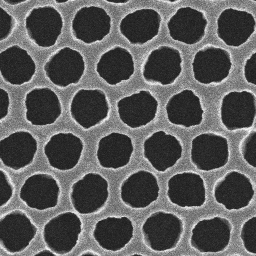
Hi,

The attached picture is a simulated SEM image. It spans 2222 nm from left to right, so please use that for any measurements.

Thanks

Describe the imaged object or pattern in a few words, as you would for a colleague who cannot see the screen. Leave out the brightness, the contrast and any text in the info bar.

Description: a regular array of holes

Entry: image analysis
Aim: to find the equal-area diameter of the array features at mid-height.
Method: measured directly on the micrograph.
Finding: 37.2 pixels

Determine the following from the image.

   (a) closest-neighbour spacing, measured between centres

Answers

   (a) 402 nanometres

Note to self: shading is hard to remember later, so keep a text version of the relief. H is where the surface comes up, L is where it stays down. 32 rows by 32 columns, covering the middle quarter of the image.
LLLLLHHHLLLLLLLLLLHHLLLLLLLLLHHH
LLLLLHHHLLLLLLLLLLHHLLLLLLLLLHHH
LLLLLHHHHLLLLLLLLHHHLLLLLLLLLHHH
LLLLHHHHHLLLLLLLHHHHLLLLLLLLHHHH
LLLHHHHHHHHLLLHHHHHHHHHHLLLHHHHH
LHHHHHHHHHHHHHHHHHHHHHHHHHHHHHHH
HHHHLLLLLHHHHHHHHHHHHHHHHHHHHHLH
HHHLLLLLLLHHHHHHHLLLLLHHHHHHLLLL
HHLLLLLLLLHHHHHLLLLLLLLHHHHLLLLL
HHLLLLLLLLLHHHLLLLLLLLLHHHLLLLLL
HHLLLLLLLLLHHLLLLLLLLLLHHHLLLLLL
HHLLLLLLLLLHHHLLLLLLLLLHHHLLLLLL
HHLLLLLLLLLHHHLLLLLLLLLHHHLLLLLL
HHLLLLLLLLHHHHLLLLLLLLLHHHLLLLLL
HHHLLLLLLHHHHHHLLLLLLHHHHHHLLLLL
HHHHLLLHHHHHHHHHLLLHHHHHHHHHHHLL
HHHHHHHHHHHHHHHHHHHHHHHHHHHHHHHH
LLHHHHHHHHHLLLLHHHHHHHLLLHHHHHHH
LLLLHHHHHHLLLLLLHHHHHLLLLLLLHHHH
LLLLLHHHHLLLLLLLLHHHLLLLLLLLLHHH
LLLLLHHHHLLLLLLLLHHHLLLLLLLLLHHH
LLLLLHHHLLLLLLLLLHHHLLLLLLLLLLHH
LLLLHHHHLLLLLLLLLHHHLLLLLLLLLHHH
LLLLHHHHLLLLLLLLLHHHHLLLLLLLLHHH
LLLHHHHHHLLLLLLLHHHHHLLLLLLLHHHH
LLLHHHHHHHLLLLLHHHHHHHLLLLLHHHHH
LHHHHHHHHHHHHHHHHHHHHHHLLHHHHHHH
HHHHHHLLHHHHHHHHHLLLLLHHHHHHLLLL
HHHHHLLLLLHHHHHHLLLLLLLHHHHLLLLL
HHHLLLLLLLLHHHHLLLLLLLLHHHLLLLLL
HHLLLLLLLLLHHHLLLLLLLLLLHHLLLLLL
HHLLLLLLLLLHHHLLLLLLLLLLHHLLLLLL